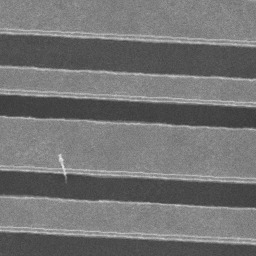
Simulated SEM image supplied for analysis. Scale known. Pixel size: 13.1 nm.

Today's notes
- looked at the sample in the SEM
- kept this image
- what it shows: lines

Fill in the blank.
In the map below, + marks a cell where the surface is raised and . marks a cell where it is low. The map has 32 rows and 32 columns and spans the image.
++++++++++++++++++++++++++++++++
++++++++++++++++++++++++++++++++
++++++++++++++++++++++++++++++++
++++++++++++++++++++++++++++++++
........++++++++++++++++++++++++
............................++++
................................
................................
+++.............................
+++++++++++++++++++++++.........
++++++++++++++++++++++++++++++++
++++++++++++++++++++++++++++++++
................++++++++++++++++
................................
................................
++++++++++++++++++..............
++++++++++++++++++++++++++++++++
++++++++++++++++++++++++++++++++
++++++++++++++++++++++++++++++++
++++++++++++++++++++++++++++++++
++++++++++++++++++++++++++++++++
......++++++++++++++++++++++++++
........................++++++++
................................
................................
+++++++++++++++++++++...........
++++++++++++++++++++++++++++++++
++++++++++++++++++++++++++++++++
++++++++++++++++++++++++++++++++
.............+++++++++++++++++++
................................
................................